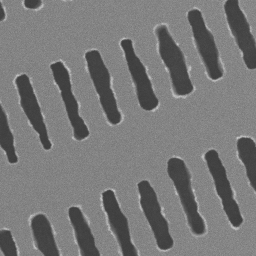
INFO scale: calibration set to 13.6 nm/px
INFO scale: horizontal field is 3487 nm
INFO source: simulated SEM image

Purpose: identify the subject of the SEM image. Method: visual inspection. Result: a regular array of holes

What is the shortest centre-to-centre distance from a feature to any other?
513 nm